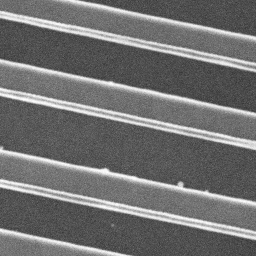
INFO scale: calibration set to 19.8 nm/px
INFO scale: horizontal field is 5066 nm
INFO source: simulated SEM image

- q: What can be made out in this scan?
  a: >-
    lines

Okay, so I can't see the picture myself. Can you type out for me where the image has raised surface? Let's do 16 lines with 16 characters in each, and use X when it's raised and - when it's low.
XXXXXXX---------
--XXXXXXXXXX----
-------XXXXXXXXX
------------XXXX
XXXX------------
XXXXXXXX--------
---XXXXXXXXXX---
-------XXXXXXXXX
------------XXXX
X---------------
XXXXXX----------
XXXXXXXXXX------
----XXXXXXXXXXX-
---------XXXXXXX
X-------------XX
XXXXX-----------